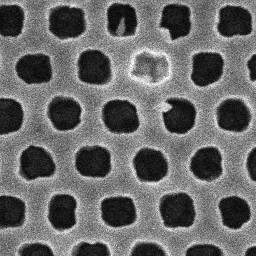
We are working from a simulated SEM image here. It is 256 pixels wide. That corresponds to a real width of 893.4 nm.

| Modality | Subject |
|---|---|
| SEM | a regular array of holes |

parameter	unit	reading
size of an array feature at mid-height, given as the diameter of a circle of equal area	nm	120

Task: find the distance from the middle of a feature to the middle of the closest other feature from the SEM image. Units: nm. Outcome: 189